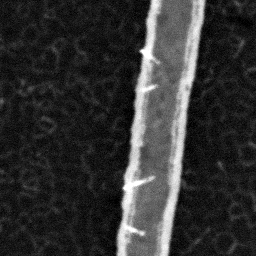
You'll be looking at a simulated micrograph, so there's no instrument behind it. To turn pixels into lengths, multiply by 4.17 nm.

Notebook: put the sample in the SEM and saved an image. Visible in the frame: one or a few lines or trenches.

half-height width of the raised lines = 183 nanometres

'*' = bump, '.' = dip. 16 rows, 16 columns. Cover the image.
..........***...
.........***....
.........***....
.........***....
.........***....
.........***....
.........**.....
.........**.....
........***.....
........***.....
........***.....
........***.....
........***.....
........***.....
........**......
........**......